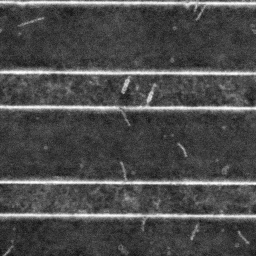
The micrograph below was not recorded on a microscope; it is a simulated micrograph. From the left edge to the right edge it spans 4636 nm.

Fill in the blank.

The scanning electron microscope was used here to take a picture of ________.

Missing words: one or a few lines or trenches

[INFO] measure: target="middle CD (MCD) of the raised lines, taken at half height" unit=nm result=603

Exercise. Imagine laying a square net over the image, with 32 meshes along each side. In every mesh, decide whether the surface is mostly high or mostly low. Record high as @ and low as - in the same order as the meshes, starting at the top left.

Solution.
--------------------------------
--------------------------------
--------------------------------
--------------------------------
--------------------------------
--------------------------------
--------------------------------
--------------------------------
--------------------------------
@@@@@@@@@@@@@@@@@@@@@@@@@@@@@@@@
@@@@@@@@@@@@@@@@@@@@@@@@@@@@@@@@
@@@@@@@@@@@@@@@@@@@@@@@@@@@@@@@@
@@@@@@@@@@@@@@@@@@@@@@@@@@@@@@@@
--------------------------------
--------------------------------
--------------------------------
--------------------------------
--------------------------------
--------------------------------
--------------------------------
--------------------------------
--------------------------------
--------------------------------
@@@@@@@@@@@@@@@@@@@@@@@@@@@@@@@@
@@@@@@@@@@@@@@@@@@@@@@@@@@@@@@@@
@@@@@@@@@@@@@@@@@@@@@@@@@@@@@@@@
@@@@@@@@@@@@@@@@@@@@@@@@@@@@@@@@
--------------------------------
--------------------------------
--------------------------------
--------------------------------
--------------------------------